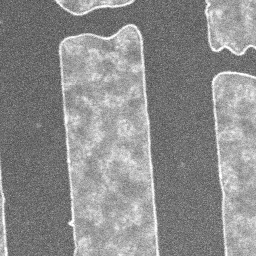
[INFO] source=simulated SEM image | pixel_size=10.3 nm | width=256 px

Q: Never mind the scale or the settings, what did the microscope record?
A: one or a few lines or trenches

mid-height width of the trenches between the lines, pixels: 80.7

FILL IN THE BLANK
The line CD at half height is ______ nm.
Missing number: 715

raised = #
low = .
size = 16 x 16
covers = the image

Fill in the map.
####..#######...
#############...
####.....####...
####.....#######
####.....#######
####.....####...
####.....####...
####.....#####..
####.....#####..
####.....#####..
####.....#####..
####......####..
#####.....####..
#####.....####..
#####.....####..
######....####..